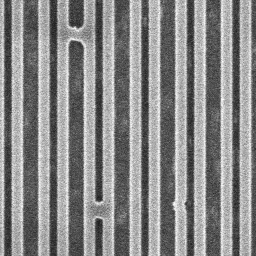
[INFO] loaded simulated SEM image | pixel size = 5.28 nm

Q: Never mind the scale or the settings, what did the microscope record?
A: parallel lines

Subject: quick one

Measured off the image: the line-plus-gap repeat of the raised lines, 120 nanometers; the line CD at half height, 56.1 nanometres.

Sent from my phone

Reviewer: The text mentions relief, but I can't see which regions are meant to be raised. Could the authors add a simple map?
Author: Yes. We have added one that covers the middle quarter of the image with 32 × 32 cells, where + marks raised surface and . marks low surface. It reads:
+....+++..++.....++..+++....+++.
+....+++..++.....++..+++....+++.
+....+++..++.....++..+++....+++.
+....+++..++.....++..+++....+++.
+....+++..++.....++..+++....+++.
+....+++..++.....++..+++....+++.
+....+++..++.....++..+++....+++.
+....+++..++.....++..+++....+++.
+....+++..++.....++..+++....+++.
+....+++..++.....++..+++....+++.
+....+++..++.....++..+++....+++.
+....+++..++.....++..+++....+++.
+....+++..++.....++..+++....+++.
+....+++..++.....++..+++....+++.
+....+++..++.....++..+++....+++.
+....+++..++.....++..+++....+++.
+....+++..++.....++..+++....+++.
+....+++..++.....++..+++....+++.
+....+++..++.....++..+++....+++.
+....+++..++.....++..+++....++..
+....+++..++.....++..+++....++..
+....+++..++.....++..+++....++..
+....+++..++.....++..+++....++..
+....+++..++.....++..+++....++..
+....+++..++.....++..+++....++..
+....+++..++.....++..+++....++..
+....+++..++.....++..+++....++..
+....+++..++.....++..+++....++..
+....+++..++.....++..+++....++..
+....+++..++.....++..+++....++..
+....+++..++.....++..+++....++..
+....+++..++.....++..+++....++..